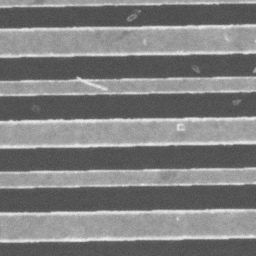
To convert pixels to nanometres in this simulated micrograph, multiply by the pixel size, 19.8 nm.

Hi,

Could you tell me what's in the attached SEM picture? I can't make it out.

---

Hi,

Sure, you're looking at lines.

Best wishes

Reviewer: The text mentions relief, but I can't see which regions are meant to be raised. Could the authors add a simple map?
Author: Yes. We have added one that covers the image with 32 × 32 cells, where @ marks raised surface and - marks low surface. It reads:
@@@@@@@@@@@@@@@@@@@@@-----------
--------------------------------
--------------------------------
----------@@@@@@@@@@@@@@@@@@@@@@
@@@@@@@@@@@@@@@@@@@@@@@@@@@@@@@@
@@@@@@@@@@@@@@@@@@@@@@@@@@@@@@@@
@@@@@@@@@@@@@@@@@@@@@@@@@@@@@@@@
--------------------------------
--------------------------------
--------------------------------
@@@@@@@@@@@@@@@@@@@@@@@@@@@@@@@@
@@@@@@@@@@@@@@@@@@@@@@@@@@------
--------------------------------
--------------------------------
--------------------------------
@@@@@@@@@@@@@@@@@@@@@@@@@@@@@@@@
@@@@@@@@@@@@@@@@@@@@@@@@@@@@@@@@
@@@@@@@@@@@@@@@@@@@@@@@@@@@@@@@@
--------------------------------
--------------------------------
--------------------------------
---@@@@@@@@@@@@@@@@@@@@@@@@@@@@@
@@@@@@@@@@@@@@@@@@@@@@@@@@@@@@@@
--------------------------------
--------------------------------
--------------------------------
---------------@@@@@@@@@@@@@@@@@
@@@@@@@@@@@@@@@@@@@@@@@@@@@@@@@@
@@@@@@@@@@@@@@@@@@@@@@@@@@@@@@@@
@@@@@@@@@@@@@@@@@@@@@@@@@@@@@@@@
--------------------------------
--------------------------------